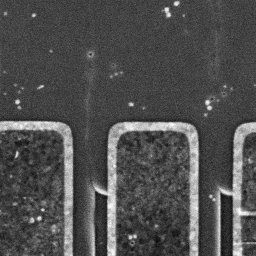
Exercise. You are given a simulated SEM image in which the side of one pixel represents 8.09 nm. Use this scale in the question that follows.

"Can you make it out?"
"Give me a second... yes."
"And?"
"wiring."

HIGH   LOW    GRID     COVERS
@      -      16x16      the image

----------------
----------------
----------------
----------------
----------------
----------------
----------------
----------------
@@@@---@@@@@---@
@@@@---@@@@@---@
@@@@---@@@@@---@
@@@@---@@@@@---@
@@@@---@@@@@---@
@@@@---@@@@@---@
@@@@---@@@@@---@
@@@@---@@@@@---@